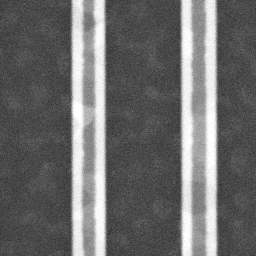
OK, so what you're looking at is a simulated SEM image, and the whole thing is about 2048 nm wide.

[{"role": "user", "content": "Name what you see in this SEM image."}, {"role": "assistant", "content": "one or a few lines or trenches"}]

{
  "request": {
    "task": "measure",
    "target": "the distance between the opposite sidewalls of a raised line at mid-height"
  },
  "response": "184 nanometres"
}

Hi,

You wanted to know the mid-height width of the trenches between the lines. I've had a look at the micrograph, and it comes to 694 nanometres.